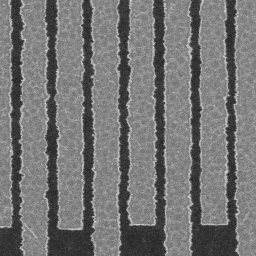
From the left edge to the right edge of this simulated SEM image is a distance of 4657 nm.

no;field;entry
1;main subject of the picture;parallel lines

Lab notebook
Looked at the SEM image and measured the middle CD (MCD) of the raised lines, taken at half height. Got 464 nm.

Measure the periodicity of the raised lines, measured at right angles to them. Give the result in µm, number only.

0.653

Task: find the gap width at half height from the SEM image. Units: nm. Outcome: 191